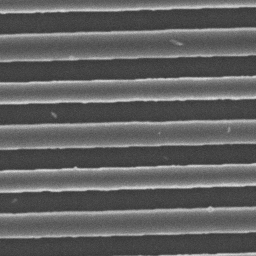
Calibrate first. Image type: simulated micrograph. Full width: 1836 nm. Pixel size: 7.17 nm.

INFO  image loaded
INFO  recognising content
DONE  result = lines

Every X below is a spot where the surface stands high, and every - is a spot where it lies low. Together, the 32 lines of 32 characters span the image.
XXXXXXXXXXXXXXXXXXXXXXXXXXXXXXXX
XXXX----------------------------
--------------------------------
--------------------------------
XXXXXXXXXXXXXXXXXXXXXXXXXXXXXXXX
XXXXXXXXXXXXXXXXXXXXXXXXXXXXXXXX
XXXXXXXXXXXXXXXXXXXXXXXXXXXXXXXX
XXXXXXX-------------------------
--------------------------------
--------------------------------
XXXXXXXXXXXXXXXXXXXXXXXXXXXXXXXX
XXXXXXXXXXXXXXXXXXXXXXXXXXXXXXXX
XXXXXXXXXXXXXXXXXXXXXXX---------
--------------------------------
--------------------------------
-------------XXXXXXXXXXXXXXXXXXX
XXXXXXXXXXXXXXXXXXXXXXXXXXXXXXXX
XXXXXXXXXXXXXXXXXXXXXXXXXXXXXXXX
XXXXXX--------------------------
--------------------------------
--------------------------------
XXXXXXXXXXXXXXXXXXXXXXXXXXXXXXXX
XXXXXXXXXXXXXXXXXXXXXXXXXXXXXXXX
XXXXXXXXXXXXXXXXXX--------------
--------------------------------
--------------------------------
-------------XXXXXXXXXXXXXXXXXXX
XXXXXXXXXXXXXXXXXXXXXXXXXXXXXXXX
XXXXXXXXXXXXXXXXXXXXXXXXXXXXXXXX
XXXXXXXX------------------------
--------------------------------
--------------------------------